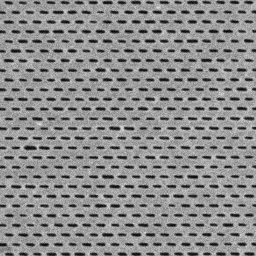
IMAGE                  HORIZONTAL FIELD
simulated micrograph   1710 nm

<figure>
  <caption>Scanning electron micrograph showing a regular array of holes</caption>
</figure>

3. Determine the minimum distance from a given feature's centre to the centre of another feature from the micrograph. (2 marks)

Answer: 78.3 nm